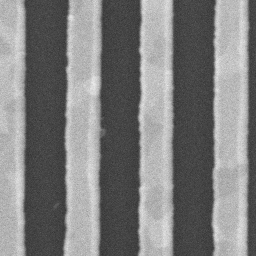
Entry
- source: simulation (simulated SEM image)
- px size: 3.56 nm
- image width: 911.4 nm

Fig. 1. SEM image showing lines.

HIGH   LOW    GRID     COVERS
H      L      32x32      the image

HHHLLLLLLHHHHLLLLLHHHLLLLLLHHHHL
HHHLLLLLLHHHLLLLLLHHHLLLLLLHHHHL
HHHLLLLLLHHHLLLLLLHHHLLLLLLHHHHL
HHHLLLLLHHHHLLLLLLHHHLLLLLLHHHHL
HHHLLLLLHHHHLLLLLLHHHLLLLLLHHHHL
HHHLLLLLHHHHLLLLLLHHHLLLLLLHHHHL
HHHLLLLLHHHHLLLLLLHHHLLLLLLHHHHL
HHHLLLLLLHHHLLLLLLHHHLLLLLLHHHHL
HHHLLLLLHHHHLLLLLLHHHLLLLLLHHHHL
HHHLLLLLHHHHLLLLLLHHHLLLLLLHHHHL
HHHLLLLLLHHHLLLLLLHHHLLLLLLHHHHL
HHHLLLLLHHHHLLLLLLHHHLLLLLLHHHHL
HHHLLLLLHHHHLLLLLLHHHLLLLLLHHHHL
HHHLLLLLHHHHLLLLLHHHHLLLLLLHHHHL
HHHLLLLLHHHHLLLLLHHHHLLLLLLHHHHL
HHHLLLLLHHHHLLLLLHHHHLLLLLLHHHHL
HHHLLLLLHHHHLLLLLLHHHLLLLLLHHHHL
HHHLLLLLHHHHLLLLLLHHHLLLLLLHHHHL
HHHLLLLLHHHHLLLLLLHHHLLLLLLHHHHL
HHHLLLLLHHHHLLLLLLHHHLLLLLLHHHHL
HHHLLLLLHHHHLLLLLLHHHLLLLLLHHHHL
HHHLLLLLHHHHLLLLLHHHHLLLLLLHHHHL
HHHLLLLLHHHHLLLLLLHHHLLLLLLHHHHL
HHHLLLLLHHHHLLLLLLHHHLLLLLLHHHHL
HHHLLLLLHHHHLLLLLLHHHLLLLLLHHHHL
HHHLLLLLHHHHLLLLLHHHHLLLLLLHHHHL
HHHLLLLLHHHHLLLLLHHHHLLLLLLHHHHL
HHHLLLLLHHHHLLLLLHHHHLLLLLLHHHHL
HHHLLLLLHHHHLLLLLHHHHLLLLLLHHHHL
HHHLLLLLHHHHLLLLLHHHHLLLLLLHHHHL
HHHLLLLLHHHHLLLLLLHHHLLLLLLHHHHL
HHHLLLLLHHHHLLLLLHHHHLLLLLLHHHHL